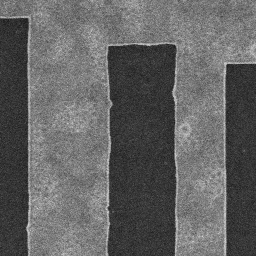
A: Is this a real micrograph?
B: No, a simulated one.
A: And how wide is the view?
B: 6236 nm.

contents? one or a few lines or trenches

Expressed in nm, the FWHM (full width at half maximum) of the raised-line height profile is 1890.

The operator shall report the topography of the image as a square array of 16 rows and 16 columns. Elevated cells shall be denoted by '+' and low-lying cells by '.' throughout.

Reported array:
++++++++++++++++
..++++++++++++++
..++++++++++++++
..+++++....+++++
..+++++....+++..
..+++++....+++..
..+++++....+++..
..+++++....+++..
..+++++....+++..
..+++++....+++..
..+++++....+++..
..+++++....+++..
..+++++....+++..
..+++++....+++..
..+++++....+++..
..+++++....+++..